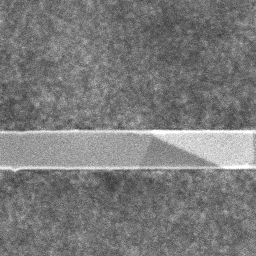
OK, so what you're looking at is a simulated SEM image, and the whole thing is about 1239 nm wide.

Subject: one or a few lines or trenches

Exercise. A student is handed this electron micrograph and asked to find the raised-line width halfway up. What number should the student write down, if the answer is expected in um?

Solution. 0.188